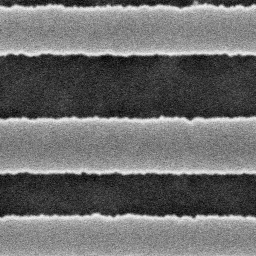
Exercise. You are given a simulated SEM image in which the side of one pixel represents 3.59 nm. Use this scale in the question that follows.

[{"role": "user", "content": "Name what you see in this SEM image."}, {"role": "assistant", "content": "lines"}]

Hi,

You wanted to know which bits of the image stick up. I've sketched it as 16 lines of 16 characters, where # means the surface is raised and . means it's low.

################
################
################
................
................
................
................
################
################
################
################
................
................
..#######.#..##.
################
################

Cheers